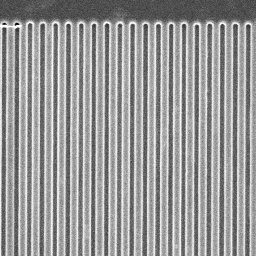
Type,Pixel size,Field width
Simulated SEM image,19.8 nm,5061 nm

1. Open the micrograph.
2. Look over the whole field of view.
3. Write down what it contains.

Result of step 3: parallel lines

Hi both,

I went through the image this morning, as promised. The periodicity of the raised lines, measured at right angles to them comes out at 0.254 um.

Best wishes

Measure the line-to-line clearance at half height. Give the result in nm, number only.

114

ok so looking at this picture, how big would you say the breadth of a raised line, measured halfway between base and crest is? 153 nanometres